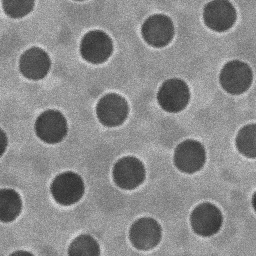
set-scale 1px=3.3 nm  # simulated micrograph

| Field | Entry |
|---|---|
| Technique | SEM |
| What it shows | a regular array of holes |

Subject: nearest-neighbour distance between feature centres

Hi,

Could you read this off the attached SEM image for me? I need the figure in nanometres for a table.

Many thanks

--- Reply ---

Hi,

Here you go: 209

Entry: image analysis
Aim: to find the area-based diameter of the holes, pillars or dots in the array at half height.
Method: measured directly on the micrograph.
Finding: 119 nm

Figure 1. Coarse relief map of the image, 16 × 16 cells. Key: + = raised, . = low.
..+++++++++++..+
+++++++++..++..+
+++++..++..+++++
+..++..+++++++++
+..+++++++++++..
++++++++++..++..
++++++..++..++++
++..++..++++++++
++..+++++++++++.
+++++++++++..++.
+++++++..++..+++
+++..++..+++++++
.++..+++++++++++
.+++++++++++..++
++++++++..++..++
++++..++..++++++